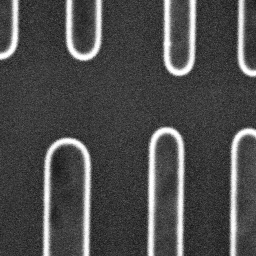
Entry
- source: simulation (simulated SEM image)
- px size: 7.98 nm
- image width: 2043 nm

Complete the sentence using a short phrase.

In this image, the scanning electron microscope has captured groups of lines, slits or small figures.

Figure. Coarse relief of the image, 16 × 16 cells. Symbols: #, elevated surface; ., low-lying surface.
#...##....##...#
#...##....##...#
#...##....##...#
.....#....##...#
................
................
................
................
..........#....#
...##....##....#
...##....##....#
...##....##....#
...##....##....#
...##....##....#
...##....##....#
...##....##....#